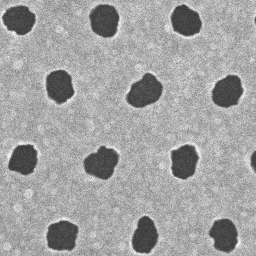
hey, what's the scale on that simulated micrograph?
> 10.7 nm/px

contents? a regular array of holes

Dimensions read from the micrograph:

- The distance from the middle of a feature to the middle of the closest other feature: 847 nanometers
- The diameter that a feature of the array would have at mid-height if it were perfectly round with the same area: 326 nanometres